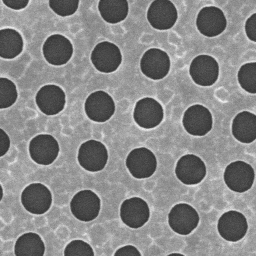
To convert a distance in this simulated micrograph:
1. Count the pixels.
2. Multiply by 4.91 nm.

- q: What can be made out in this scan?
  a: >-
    a regular array of holes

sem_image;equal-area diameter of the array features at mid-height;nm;155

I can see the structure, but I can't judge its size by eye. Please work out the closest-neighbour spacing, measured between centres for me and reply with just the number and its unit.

242 nanometres